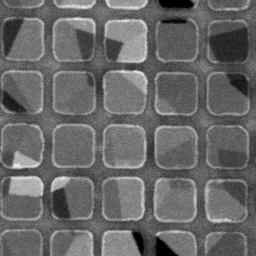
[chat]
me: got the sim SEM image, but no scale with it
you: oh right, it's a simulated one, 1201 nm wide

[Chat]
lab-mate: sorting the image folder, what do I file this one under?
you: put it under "a regular array of raised bodies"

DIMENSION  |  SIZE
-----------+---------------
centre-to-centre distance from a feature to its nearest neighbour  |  0.241 micrometres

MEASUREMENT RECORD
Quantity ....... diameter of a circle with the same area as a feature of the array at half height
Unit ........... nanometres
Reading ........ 218